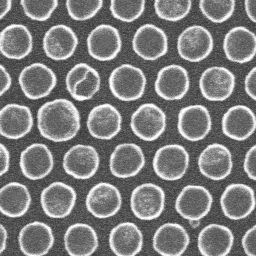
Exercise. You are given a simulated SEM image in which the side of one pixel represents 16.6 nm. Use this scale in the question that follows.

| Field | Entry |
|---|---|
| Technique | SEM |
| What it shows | a regular array of raised bodies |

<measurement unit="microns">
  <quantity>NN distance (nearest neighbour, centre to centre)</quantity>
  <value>0.74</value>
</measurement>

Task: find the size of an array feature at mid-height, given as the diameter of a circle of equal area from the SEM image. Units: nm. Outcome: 552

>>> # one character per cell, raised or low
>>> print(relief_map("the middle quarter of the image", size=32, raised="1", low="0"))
00011100000000110000000000010000
00111110000001111110000001111100
01111111000011111111000011111100
01111111100011111111000011111110
01111111100011111111000111111110
01111111000011111111000111111110
01111111000011111111000111111110
00111110000001111110000011111100
00011100000000111100000001110000
10000000000000000000000000000000
11000000000000000000110000000000
11100001111110000001111100000011
11100001111110000011111110000111
11110011111111000111111110000111
11110011111111000111111110000111
11110011111111000111111110000111
11100011111111000111111110000111
11100001111110000011111100000011
10000000011000000000111000000001
00000000000000000000000000000000
00011000000000111100000000111000
01111111000001111110000011111100
01111111000011111110000111111110
11111111000011111111000111111110
11111111000011111111000111111110
11111111000011111110000111111110
01111111000011111100000111111100
00111110000011111100000011111100
00001000000000000000000001110000
00000000000000000000000000000000
10000000111100000001111000000000
11000001111110000011111100000011